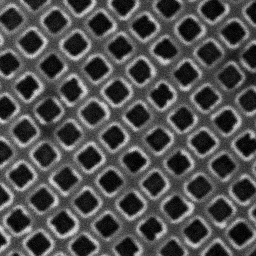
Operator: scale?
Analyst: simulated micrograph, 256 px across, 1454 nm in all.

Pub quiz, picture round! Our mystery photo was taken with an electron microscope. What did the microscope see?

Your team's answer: a regular array of holes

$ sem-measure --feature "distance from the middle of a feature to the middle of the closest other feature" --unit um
0.177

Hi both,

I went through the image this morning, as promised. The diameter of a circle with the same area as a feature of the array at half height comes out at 124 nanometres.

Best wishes